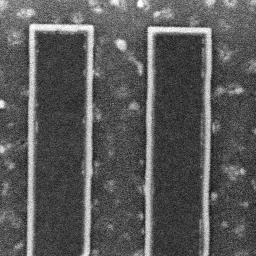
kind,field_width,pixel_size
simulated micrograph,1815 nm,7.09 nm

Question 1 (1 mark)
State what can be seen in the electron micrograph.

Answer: one or a few lines or trenches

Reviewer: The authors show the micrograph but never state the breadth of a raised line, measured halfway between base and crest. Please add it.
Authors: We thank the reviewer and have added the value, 58.2 px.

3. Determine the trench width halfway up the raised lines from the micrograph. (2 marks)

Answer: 425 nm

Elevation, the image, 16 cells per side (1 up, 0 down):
0000000000000000
0000000000000000
0011110001111000
0011110001111000
0011110001111000
0011110001111000
0011110001111000
0011110001111000
0011110001111000
0011110001111000
0011110001111000
0011100001111000
0011100001111000
0011100001111000
0011100001111000
0011100001111000